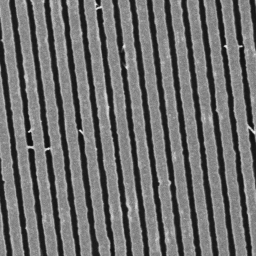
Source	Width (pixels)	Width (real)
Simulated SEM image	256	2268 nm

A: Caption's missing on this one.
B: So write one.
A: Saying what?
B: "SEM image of parallel lines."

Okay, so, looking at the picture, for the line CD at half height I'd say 103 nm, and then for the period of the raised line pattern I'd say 151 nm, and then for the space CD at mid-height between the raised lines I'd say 48.4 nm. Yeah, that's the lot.